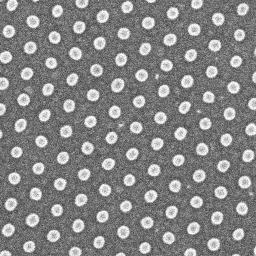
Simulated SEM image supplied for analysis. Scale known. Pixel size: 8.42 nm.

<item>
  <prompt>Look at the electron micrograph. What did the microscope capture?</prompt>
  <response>a regular array of raised bodies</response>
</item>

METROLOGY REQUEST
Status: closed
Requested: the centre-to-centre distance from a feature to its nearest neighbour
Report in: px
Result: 25.9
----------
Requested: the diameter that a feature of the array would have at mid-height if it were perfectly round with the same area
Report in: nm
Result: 96.9